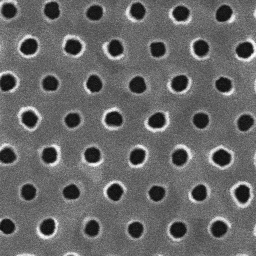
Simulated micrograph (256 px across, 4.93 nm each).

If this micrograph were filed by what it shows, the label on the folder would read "a regular array of holes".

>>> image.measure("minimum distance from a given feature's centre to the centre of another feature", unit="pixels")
40.5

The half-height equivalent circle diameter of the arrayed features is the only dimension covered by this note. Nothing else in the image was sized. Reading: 17 px